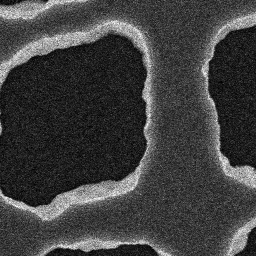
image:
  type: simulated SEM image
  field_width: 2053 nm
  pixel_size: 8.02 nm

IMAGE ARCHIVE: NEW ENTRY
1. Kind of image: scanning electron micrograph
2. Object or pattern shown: holes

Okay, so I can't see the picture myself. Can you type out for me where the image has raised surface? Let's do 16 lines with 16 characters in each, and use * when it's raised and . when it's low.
..**************
**************..
*****....*****..
**.......****...
.........****...
.........****...
.........****...
.........*****..
.........*****..
.........*****..
.........******.
........********
*...************
****************
****************
***.*.....*****.